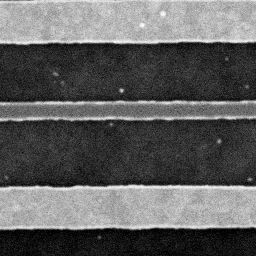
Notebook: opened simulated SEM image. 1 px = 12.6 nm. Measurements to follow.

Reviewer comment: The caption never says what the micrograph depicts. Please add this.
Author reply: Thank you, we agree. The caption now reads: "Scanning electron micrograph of lines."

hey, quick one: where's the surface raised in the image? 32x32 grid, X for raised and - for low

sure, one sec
XXXXXXXXXXXXXXXXXXXXXXXXXXXXXXXX
XXXXXXXXXXXXXXXXXXXXXXXXXXXXXXXX
XXXXXXXXXXXXXXXXXXXXXXXXXXXXXXXX
XXXXXXXXXXXXXXXXXXXXXXXXXXXXXXXX
XXXXXXXXXXXXXXXXXXXXXXXXXXXXXXXX
--------------------------------
--------------------------------
--------------------------------
--------------------------------
--------------------------------
--------------------------------
--------------------------------
--------------------------------
XXXXXXXXXXXXXXXXXXXXXXXXXXXXXXXX
XXXXXXXXXXXXXXXXXXXXXXXXXXXXXXXX
--------------------------------
--------------------------------
--------------------------------
--------------------------------
--------------------------------
--------------------------------
--------------------------------
--------------------------------
-XXXXXX--XXXXXXXXXXXXXXXXXXXXXXX
XXXXXXXXXXXXXXXXXXXXXXXXXXXXXXXX
XXXXXXXXXXXXXXXXXXXXXXXXXXXXXXXX
XXXXXXXXXXXXXXXXXXXXXXXXXXXXXXXX
XXXXXXXXXXXXXXXXXXXXXXXXXXXXXXXX
XXXXXXXXXXXX---XXXX-----XX------
--------------------------------
--------------------------------
--------------------------------